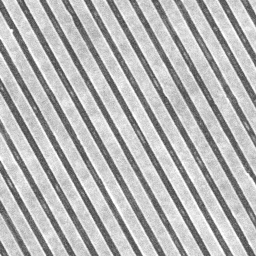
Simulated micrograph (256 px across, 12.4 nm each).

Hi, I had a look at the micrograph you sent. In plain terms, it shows parallel lines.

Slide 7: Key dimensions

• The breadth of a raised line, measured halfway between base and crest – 0.158 microns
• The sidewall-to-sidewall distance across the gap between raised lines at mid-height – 90.5 nm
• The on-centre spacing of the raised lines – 242 nanometres